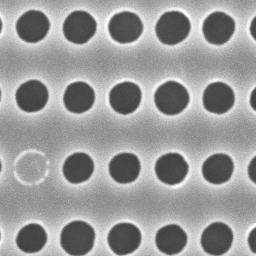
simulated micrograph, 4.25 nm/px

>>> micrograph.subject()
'a regular array of holes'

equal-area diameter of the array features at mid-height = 143 nanometers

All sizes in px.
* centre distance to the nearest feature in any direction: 46.4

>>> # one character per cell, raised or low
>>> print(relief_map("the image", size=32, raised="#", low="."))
################################
###..####..####.#####..####.####
##....##....##....##....##...##.
##....##....#.....#.....#....##.
##....##....##....##....#....##.
#########..#########..####..####
################################
################################
################################
################################
###..####..####..###...###..####
##....##....##....#....##....##.
##....##....##....#.....#....##.
##...###...###...###...###...##.
################################
################################
################################
################################
################################
#########..###...###...###...###
########....##....#.....#....##.
########....##....#.....#....##.
########...###...###...###...##.
################################
################################
################################
################################
################################
###..###....##...###...###...###
##....##....#.....#....##....##.
##....##....#.....#....##....##.
###..###...###...###...###..####